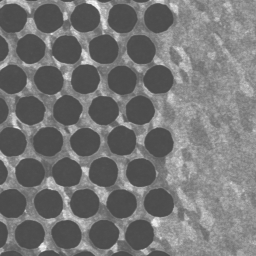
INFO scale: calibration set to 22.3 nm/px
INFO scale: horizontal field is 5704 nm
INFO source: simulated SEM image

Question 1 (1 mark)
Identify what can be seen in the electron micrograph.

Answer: a regular array of holes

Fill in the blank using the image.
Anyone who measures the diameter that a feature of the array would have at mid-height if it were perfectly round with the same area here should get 662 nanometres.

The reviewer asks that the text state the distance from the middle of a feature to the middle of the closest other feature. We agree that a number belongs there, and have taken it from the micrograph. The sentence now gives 790 nm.